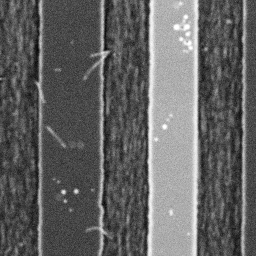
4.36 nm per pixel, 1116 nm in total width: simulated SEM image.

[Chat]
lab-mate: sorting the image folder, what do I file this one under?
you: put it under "lines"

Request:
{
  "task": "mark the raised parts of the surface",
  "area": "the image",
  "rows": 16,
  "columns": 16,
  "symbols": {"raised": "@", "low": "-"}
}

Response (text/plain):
--@@@@---@@@---@
---@@@---@@@---@
--@@@@---@@@---@
--@@@@@--@@@---@
--@@@@---@@@---@
--@@@@---@@@---@
--@@@@---@@@---@
--@@@@---@@@---@
--@@@@---@@@---@
--@@@@---@@@---@
--@@@@---@@@---@
--@@@@---@@@---@
--@@@@---@@@---@
--@@@@---@@@---@
--@@@@---@@@---@
--@@@@---@@@---@